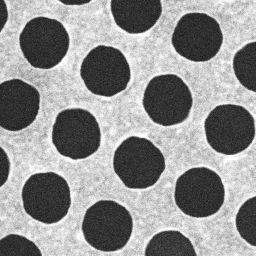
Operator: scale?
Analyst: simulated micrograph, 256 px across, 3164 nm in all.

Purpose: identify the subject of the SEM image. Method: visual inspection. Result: a regular array of holes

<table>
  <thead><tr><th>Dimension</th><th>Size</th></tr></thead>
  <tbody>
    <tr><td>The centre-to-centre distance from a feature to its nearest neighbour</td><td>839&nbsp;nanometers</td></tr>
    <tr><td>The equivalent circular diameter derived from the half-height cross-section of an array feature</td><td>637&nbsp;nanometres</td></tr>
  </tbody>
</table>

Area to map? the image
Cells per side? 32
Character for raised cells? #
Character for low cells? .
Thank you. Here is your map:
.#######...###......############
.#############......############
.###...#######......##.....#####
###.....#######....###......####
##.......############.......####
##.......#############......###.
###.....###....#######.....###..
###.....##......########..###...
#####..###......#############...
##########......###...#######...
....#######.....##.....#######..
.....######....###......########
.....#############......########
.....####.########......###....#
.....##.....#######.....##......
....###.....########..####......
######.......#############......
#######......##....#######......
#######.....###.....######.....#
.#######...###......############
.#############.......###########
.#####.#######......###....#####
.##.....#######.....##......####
###......#######..####......####
###......#############......####
###......###...#######......##..
###.....###.....#######....###..
####....##.......############...
##########.......#############..
#..#######......###....#######..
....#######.....##......#######.
.....########.####......########